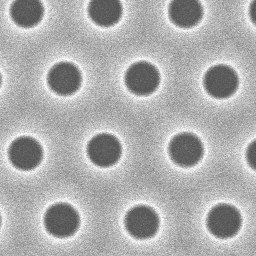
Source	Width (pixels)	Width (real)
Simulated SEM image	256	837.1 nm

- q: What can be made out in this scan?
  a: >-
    a regular array of holes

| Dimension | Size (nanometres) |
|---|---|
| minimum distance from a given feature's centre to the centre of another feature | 254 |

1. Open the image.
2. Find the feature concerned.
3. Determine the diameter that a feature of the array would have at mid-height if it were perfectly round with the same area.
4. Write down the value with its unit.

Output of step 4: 113 nm